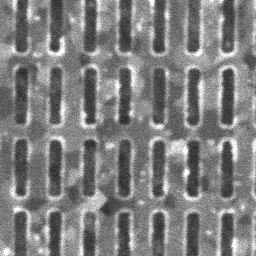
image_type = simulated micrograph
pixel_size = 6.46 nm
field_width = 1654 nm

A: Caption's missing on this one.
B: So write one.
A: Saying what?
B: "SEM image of a regular array of holes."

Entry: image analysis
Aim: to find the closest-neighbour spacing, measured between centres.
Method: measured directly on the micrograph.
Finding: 34.2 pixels